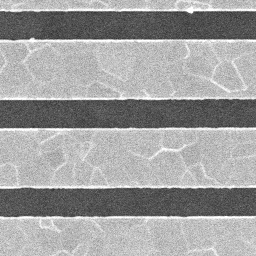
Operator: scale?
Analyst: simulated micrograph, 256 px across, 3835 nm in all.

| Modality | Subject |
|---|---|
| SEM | lines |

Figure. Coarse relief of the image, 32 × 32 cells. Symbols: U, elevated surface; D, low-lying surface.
UUUUUUUUUUUUUUUUUUUUUUUUUUUUUUUU
DDDDDDDDDDDDDDDDDDDDDDDUDDDDDDDD
DDDDDDDDDDDDDDDDDDDDDDDDDDDDDDDD
DDDDDDDDDDDDDDDDDDDDDDDDDDDDDDDD
DDDDDDDDDDDDDDDDDDDDDDDDDDDDDDDD
UUUUUUUUUUUUUUUUUUUUUUUUUUUUUUUU
UUUUUUUUUUUUUUUUUUUUUUUUUUUUUUUU
UUUUUUUUUUUUUUUUUUUUUUUUUUUUUUUU
UUUUUUUUUUUUUUUUUUUUUUUUUUUUUUUU
UUUUUUUUUUUUUUUUUUUUUUUUUUUUUUUU
UUUUUUUUUUUUUUUUUUUUUUUUUUUUUUUU
UUUUUUUUUUUUUUUUUUUUUUUUUUUUUUUU
DDDDDDDDDDDDDDDDDDDDDDDDDDDDDDDD
DDDDDDDDDDDDDDDDDDDDDDDDDDDDDDDD
DDDDDDDDDDDDDDDDDDDDDDDDDDDDDDDD
DDDDDDDDDDDDDDDDDDDDDDDDDDDDDDDD
UUUUUUUUUUUUUUUUUUUUUUUUUUUUUUUU
UUUUUUUUUUUUUUUUUUUUUUUUUUUUUUUU
UUUUUUUUUUUUUUUUUUUUUUUUUUUUUUUU
UUUUUUUUUUUUUUUUUUUUUUUUUUUUUUUU
UUUUUUUUUUUUUUUUUUUUUUUUUUUUUUUU
UUUUUUUUUUUUUUUUUUUUUUUUUUUUUUUU
UUUUUUUUUUUUUUUUUUUUUUUUUUUUUUUU
DDDDDDDDDDDDDDDDDDDDDDDDDDDDDDDD
DDDDDDDDDDDDDDDDDDDDDDDDDDDDDDDD
DDDDDDDDDDDDDDDDDDDDDDDDDDDDDDDD
DDDDDDDDDDDDDDDDDDDDDDDDDDDDDDDD
UUUUUUUUUUUUUUUUUUUUUUUUUUUUUUUU
UUUUUUUUUUUUUUUUUUUUUUUUUUUUUUUU
UUUUUUUUUUUUUUUUUUUUUUUUUUUUUUUU
UUUUUUUUUUUUUUUUUUUUUUUUUUUUUUUU
UUUUUUUUUUUUUUUUUUUUUUUUUUUUUUUU